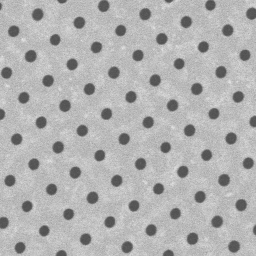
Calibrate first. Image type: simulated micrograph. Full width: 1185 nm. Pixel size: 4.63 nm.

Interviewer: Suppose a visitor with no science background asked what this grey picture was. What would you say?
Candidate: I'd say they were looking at a regular array of holes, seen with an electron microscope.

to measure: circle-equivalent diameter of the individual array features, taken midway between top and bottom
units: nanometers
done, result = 52.5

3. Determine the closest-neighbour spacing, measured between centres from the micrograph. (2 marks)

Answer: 136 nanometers